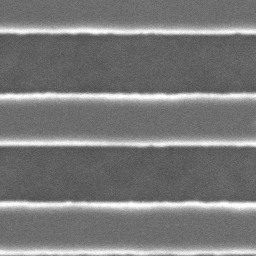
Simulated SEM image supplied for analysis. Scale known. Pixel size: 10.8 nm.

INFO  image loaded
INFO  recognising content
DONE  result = lines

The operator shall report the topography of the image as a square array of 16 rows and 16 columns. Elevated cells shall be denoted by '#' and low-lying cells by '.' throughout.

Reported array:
################
################
................
................
................
................
################
################
################
................
................
................
................
################
################
################